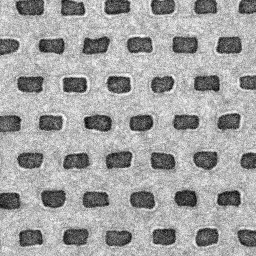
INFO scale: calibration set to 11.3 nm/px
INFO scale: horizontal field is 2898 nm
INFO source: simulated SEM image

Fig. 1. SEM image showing a regular array of holes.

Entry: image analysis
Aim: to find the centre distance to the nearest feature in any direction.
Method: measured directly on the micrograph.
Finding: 488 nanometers